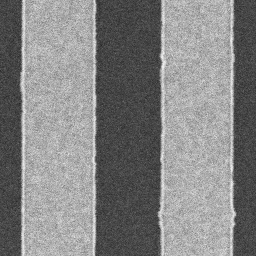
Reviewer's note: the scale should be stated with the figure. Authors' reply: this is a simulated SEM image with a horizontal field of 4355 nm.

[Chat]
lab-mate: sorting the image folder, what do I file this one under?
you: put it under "one or a few lines or trenches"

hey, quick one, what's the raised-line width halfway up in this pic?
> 1190 nm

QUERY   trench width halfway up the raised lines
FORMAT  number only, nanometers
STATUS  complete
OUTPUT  1160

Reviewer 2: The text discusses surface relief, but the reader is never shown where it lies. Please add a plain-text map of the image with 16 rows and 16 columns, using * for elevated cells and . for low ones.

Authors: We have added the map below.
..****....****..
..****....****..
..****....****..
..****....*****.
.*****....****..
.*****....****..
.*****....****..
.*****....****..
.*****....****..
.*****....****..
.*****....****..
.*****....****..
.*****....****..
.*****....*****.
.*****....****..
.*****....****..